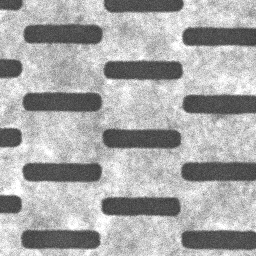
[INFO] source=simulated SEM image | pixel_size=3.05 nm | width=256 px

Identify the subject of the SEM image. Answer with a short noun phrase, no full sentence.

holes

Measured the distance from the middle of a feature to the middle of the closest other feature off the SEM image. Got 206 nanometers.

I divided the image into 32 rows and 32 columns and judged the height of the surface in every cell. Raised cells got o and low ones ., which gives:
...oooooooooo..........ooooooooo
oooooooooooooo........oooooooooo
oooooooooooooooooooooooooooooooo
ooo..........oooooooooo.........
ooo..........oooooooooo.........
ooooooooo...ooooooooooo.........
oooooooooooooooooooooooooooooooo
..oooooooooooooooooooooooooooooo
...oooooooooo..........ooooooooo
..ooooooooooo..........ooooooooo
oooooooooooooooooooooooooooooooo
oooooo.ooooooooooooooooooooooooo
ooo..........oooooooooo.........
ooo..........oooooooooo.........
oooooooooooooooooooooooooooooooo
oooooooooooooooooooooooooooooooo
...oooooooooo.........oooooooooo
...oooooooooo..........ooooooooo
..oooooooooooo........oooooooooo
oooooooooooooooooooooooooooooooo
ooo.........ooooooooooo.........
ooo..........oooooooooo.........
ooo.........ooooooooooo.........
oooooooooooooooooooooooooooooooo
..oooooooooooo.ooooooooooooooooo
...oooooooooo..........ooooooooo
..ooooooooooo..........ooooooooo
oooooooooooooooooooooooooooooooo
oooooooooooooooooooooooooooooooo
ooo..........oooooooooo.........
ooo..........oooooooooo.........
oooooooooooooooooooooooooooooooo